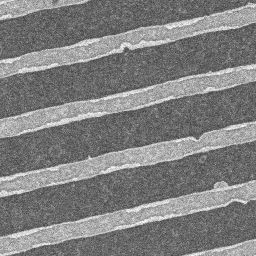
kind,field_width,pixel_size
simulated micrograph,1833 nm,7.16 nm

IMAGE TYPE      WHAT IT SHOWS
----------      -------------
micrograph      parallel lines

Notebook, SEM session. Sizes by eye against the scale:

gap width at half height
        281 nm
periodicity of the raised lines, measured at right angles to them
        411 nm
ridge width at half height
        128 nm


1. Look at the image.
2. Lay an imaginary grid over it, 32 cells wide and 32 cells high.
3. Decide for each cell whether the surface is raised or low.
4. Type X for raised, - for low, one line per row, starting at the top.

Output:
XXXXXXXXXX---------------------X
XXXX------------------------XXXX
------------------------XXXXXXXX
------------------XXXXXXXXXXX---
--------------XXXXXXXXXX--------
----------XXXXXXXXXX------------
-----XXXXXXXXXX-----------------
XXXXXXXXXXX---------------------
XXXXXX-----------------------XXX
X-----------------------XXXXXXXX
--------------------XXXXXXXXXX--
----------------XXXXXXXXXX------
------------XXXXXXXXX-----------
------XXXXXXXXXXX---------------
--XXXXXXXXXX--------------------
XXXXXXXX----------------------XX
XXX-----------------------XXXXXX
----------------------XXXXXXXXXX
-----------------XXXXXXXXXX-----
------------XXXXXXXXXXX---------
---------XXXXXXXXXX-------------
----XXXXXXXXXX------------------
XXXXXXXXXX----------------------
XXXXX----------------------XXXXX
-----------------------XXXXXXXXX
-------------------XXXXXXXXXX---
--------------XXXXXXXXXX--------
----------XXXXXXXXXX------------
-----XXXXXXXXXXX----------------
-XXXXXXXXXX---------------------
XXXXXX------------------------XX
XXX----------------------XXXXXXX